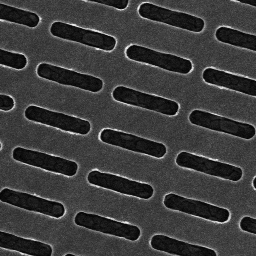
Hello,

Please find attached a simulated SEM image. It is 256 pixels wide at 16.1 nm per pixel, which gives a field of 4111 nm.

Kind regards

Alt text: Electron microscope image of a regular array of holes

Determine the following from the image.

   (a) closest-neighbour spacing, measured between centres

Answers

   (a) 699 nanometers